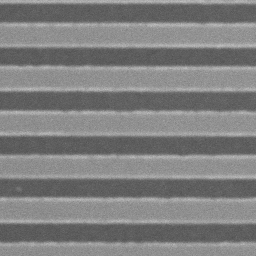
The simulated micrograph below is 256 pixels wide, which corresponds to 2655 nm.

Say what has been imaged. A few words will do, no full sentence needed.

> lines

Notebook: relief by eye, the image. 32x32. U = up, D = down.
DDDDDDDDDDDDDDDDDDDDDDDDDDDDDDDD
DDDDDDDDDDDDDDDDDDDDDDDDDDDDDDDD
DDDDDDDDDDDDDDDDDDDDDDDDDDDDDDDD
UUUUUUUUUUUUUUUUUUUUUUUUUUUUUUUU
UUUUUUUUUUUUUUUUUUUUUUUUUUUUUUUU
UUUUUUUUUUUUUUUUUUUUUUUUUUUUUUUU
DDDDDDDDDDDDDDDDDDDDDDDDDDDDDDDD
DDDDDDDDDDDDDDDDDDDDDDDDDDDDDDDD
UUUUUUUUUUUUUUUUUUUUUUUUUUUUUUUU
UUUUUUUUUUUUUUUUUUUUUUUUUUUUUUUU
UUUUUUUUUUUUUUUUUUUUUUUUUUUUUUUU
DDDDDDDDDDDDDDDDDDDDDDDDDDDDDDDD
DDDDDDDDDDDDDDDDDDDDDDDDDDDDDDDD
DDDDDDDDDDDDDDDDDDDDDDDDDDDDDDDD
UUUUUUUUUUUUUUUUUUUUUUUUUUUUUUUU
UUUUUUUUUUUUUUUUUUUUUUUUUUUUUUUU
UUUUUUUUUUUUUUUUUUUUUUUUUUUUUUUU
DDDDDDDDDDDDDDDDDDDDDDDDDDDDDDDD
DDDDDDDDDDDDDDDDDDDDDDDDDDDDDDDD
DDUDUDDDDDDDDUUDDDDDDDDDDDDDDDDD
UUUUUUUUUUUUUUUUUUUUUUUUUUUUUUUU
UUUUUUUUUUUUUUUUUUUUUUUUUUUUUUUU
DDDDDDDDDDDDDDDDDDDDDDDDDDDDDDDD
DDDDDDDDDDDDDDDDDDDDDDDDDDDDDDDD
DDDDDDDDDDDDDDDDDDDDDDDDDDDDDDDD
UUUUUUUUUUUUUUUUUUUUUUUUUUUUUUUU
UUUUUUUUUUUUUUUUUUUUUUUUUUUUUUUU
UUUUUUUUUUUUUUUUUUUUUUUUUUUUUUUU
DDDDDDDDDDDDDDDDDDDDDDDDDDDDDDDD
DDDDDDDDDDDDDDDDDDDDDDDDDDDDDDDD
UUUUUUUUUUUUUUUUUUUUUUUUUUUUUUUU
UUUUUUUUUUUUUUUUUUUUUUUUUUUUUUUU